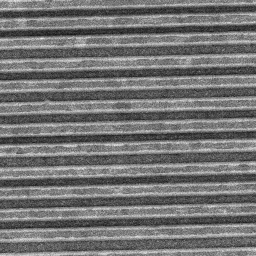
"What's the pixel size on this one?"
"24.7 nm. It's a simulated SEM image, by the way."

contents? parallel lines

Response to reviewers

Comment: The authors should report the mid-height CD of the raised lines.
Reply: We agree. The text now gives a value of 262 nm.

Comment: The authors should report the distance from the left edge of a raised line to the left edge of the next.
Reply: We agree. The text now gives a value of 0.521 µm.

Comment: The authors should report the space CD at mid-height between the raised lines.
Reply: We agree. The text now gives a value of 10.6 px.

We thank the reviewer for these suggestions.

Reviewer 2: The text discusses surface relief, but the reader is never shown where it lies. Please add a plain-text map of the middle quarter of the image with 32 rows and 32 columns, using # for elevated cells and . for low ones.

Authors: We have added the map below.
################################
#...............................
................................
...................####......###
################################
################################
#####...........................
................................
................................
.####.....######################
################################
###########################.....
................................
................................
..................##...#########
################################
################################
...###..........................
................................
......................##########
################################
################################
###...#..##.....................
................................
................................
.................###############
################################
################################
................................
................................
...........#####################
################################